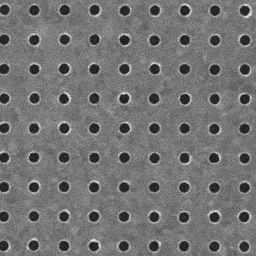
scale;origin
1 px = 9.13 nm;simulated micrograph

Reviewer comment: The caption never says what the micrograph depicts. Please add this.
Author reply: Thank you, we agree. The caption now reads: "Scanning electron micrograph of a regular array of holes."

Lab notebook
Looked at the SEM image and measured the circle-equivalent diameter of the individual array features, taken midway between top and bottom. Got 99.1 nanometers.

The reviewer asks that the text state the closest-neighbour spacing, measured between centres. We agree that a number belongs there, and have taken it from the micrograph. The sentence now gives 267 nm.